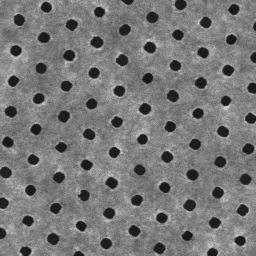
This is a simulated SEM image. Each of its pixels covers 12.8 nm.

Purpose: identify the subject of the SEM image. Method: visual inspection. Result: a regular array of holes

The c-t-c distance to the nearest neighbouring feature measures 390 nm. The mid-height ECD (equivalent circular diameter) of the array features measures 0.145 um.